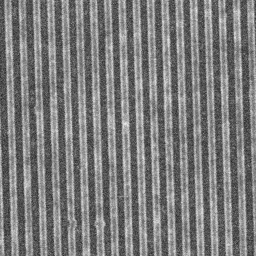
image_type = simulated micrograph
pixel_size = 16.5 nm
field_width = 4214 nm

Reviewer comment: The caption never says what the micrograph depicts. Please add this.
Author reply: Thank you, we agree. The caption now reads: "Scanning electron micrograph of parallel lines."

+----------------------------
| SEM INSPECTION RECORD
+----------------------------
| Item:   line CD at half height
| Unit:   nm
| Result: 82.3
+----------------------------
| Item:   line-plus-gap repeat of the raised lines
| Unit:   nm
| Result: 235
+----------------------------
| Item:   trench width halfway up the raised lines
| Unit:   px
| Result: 9.25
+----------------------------